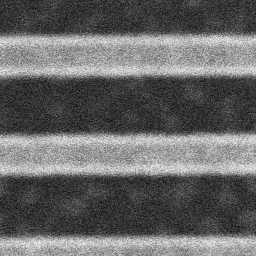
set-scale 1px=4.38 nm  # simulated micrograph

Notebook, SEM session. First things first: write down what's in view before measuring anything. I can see one or a few lines or trenches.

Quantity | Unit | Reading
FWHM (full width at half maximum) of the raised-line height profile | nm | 130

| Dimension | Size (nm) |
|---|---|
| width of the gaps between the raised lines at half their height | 312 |